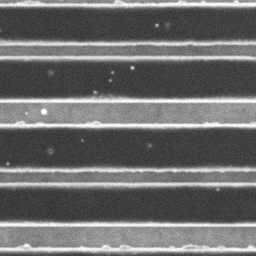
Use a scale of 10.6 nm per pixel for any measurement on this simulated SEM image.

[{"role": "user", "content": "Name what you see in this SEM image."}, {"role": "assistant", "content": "lines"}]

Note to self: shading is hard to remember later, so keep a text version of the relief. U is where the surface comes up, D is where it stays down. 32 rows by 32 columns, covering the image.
DDDDDDDDDDDDDDDDDDDDDDDDDDDDDDDD
UUUUUUUUUUUUUUUUUUUUUUUUUUUUUUUU
UUUUUUUUUUUUUUUUUUUUUUUUUUUUUUUU
UUUUUUUUUUUUUUUUUUUUUUUUUUUUUUUU
UUUUUUUUUUUUUUUUUUUUUUUUUUUUUUUU
DDDDDDDDDDDDDDDDDDDDDDDDDDDDDDDD
DDDDDDDDDDDDDDDDDDDDDDDDDDDDDDDD
UUUUUUUUUUUUUUUUUUUUUUUUUUUUUUUU
UUUUUUUUUUUUUUUUUUUUUUUUUUUUUUUU
UUUUUUUUUUUUUUUUUUUUUUUUUUUUUUUU
UUUUUUUUUUUUUUUUUUUUUUUUUUUUUUUU
UUUUUUUUUUUUUUUUUUUUUUUUUUUUUUUU
UUUUUUUUUUUUUUUUUUUUUUUUUUUUUUUU
DDDDDDDDDDDDDDDDDDDDDDDDDDDDDDDD
DDDDDDDDDDDDDDDDDDDDDDDDDDDDDDDD
DDDDDDDDDDDDDDDDDDDDDDDDDDDDDDDD
UUUUUUUUUUUUUUUUUUUUUUUUUUUUUUUU
UUUUUUUUUUUUUUUUUUUUUUUUUUUUUUUU
UUUUUUUUUUUUUUUUUUUUUUUUUUUUUUUU
UUUUUUUUUUUUUUUUUUUUUUUUUUUUUUUU
UUUUUUUUUUUUUUUUUUUUUUUUUUUUUUUU
DDDDDDDDDDDDDDDDDDDDDDDDDDDDDDDD
DDDDDDDDDDDDDDDDDDDDDDDDDDDDDDDD
UUUUUUUUUUUUUUUUUUUUUUUUUUUUUUUU
UUUUUUUUUUUUUUUUUUUUUUUUUUUUUUUU
UUUUUUUUUUUUUUUUUUUUUUUUUUUUUUUU
UUUUUUUUUUUUUUUUUUUUUUUUUUUUUUUU
UUUUUUUUUUUUUUUUUUUUUUUUUUUUUUUU
DDDDDDDDDDDDDDDDDDDDDDDDDDDDDDDD
DDDDDDDDDDDDDDDDDDDDDDDDDDDDDDDD
DDDDDDDDDDDDDDDDDDDDDDDDDDDDDDDD
UUUUUUUUUUUUUUUUUUUUUUUUUUUUUUUU